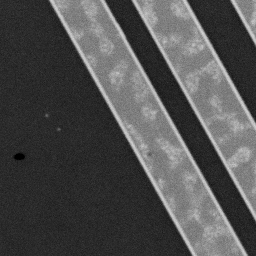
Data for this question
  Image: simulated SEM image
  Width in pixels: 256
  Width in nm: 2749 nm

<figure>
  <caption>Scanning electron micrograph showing one or a few lines or trenches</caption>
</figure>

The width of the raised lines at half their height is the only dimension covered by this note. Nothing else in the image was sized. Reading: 480 nanometres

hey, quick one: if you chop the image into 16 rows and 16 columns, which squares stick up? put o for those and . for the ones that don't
...oooo..ooo...o
....ooo..ooo...o
.....ooo..ooo...
.....ooo..ooo...
......ooo..ooo..
......oooo.oooo.
.......ooo..ooo.
.......oooo..ooo
........ooo..ooo
........oooo..oo
.........ooo..oo
..........ooo..o
..........ooo..o
...........ooo..
...........oooo.
............ooo.